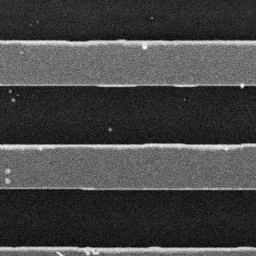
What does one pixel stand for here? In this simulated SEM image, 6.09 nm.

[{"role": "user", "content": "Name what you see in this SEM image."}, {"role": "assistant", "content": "lines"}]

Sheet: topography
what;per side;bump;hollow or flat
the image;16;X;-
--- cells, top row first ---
----------------
----------------
----------------
XXXXXXXXXXXXXXXX
XXXXXXXXXXXXXXXX
----------------
----------------
----------------
----------------
XXXXXXXXXXXXXXXX
XXXXXXXXXXXXXXXX
XXXXXXXXXXXXXXXX
----------------
----------------
----------------
-XXXXX---------X